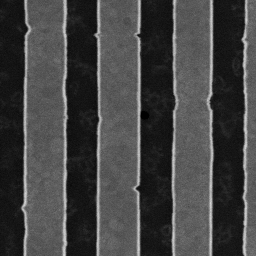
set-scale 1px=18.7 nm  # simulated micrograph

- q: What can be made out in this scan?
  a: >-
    one or a few lines or trenches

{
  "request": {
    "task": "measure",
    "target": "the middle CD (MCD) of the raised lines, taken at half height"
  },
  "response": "743 nm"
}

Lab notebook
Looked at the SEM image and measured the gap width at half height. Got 643 nm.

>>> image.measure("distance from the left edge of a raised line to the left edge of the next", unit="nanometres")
1380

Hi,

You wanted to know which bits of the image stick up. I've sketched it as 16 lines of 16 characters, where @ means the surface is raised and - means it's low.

--@@--@@@--@@--@
--@@--@@@--@@--@
--@@--@@@--@@--@
--@@--@@@--@@--@
--@@--@@@--@@--@
--@@--@@@--@@--@
--@@--@@@--@@--@
--@@--@@@--@@--@
--@@--@@@--@@--@
--@@--@@@--@@--@
--@@--@@@--@@--@
--@@--@@@--@@--@
--@@--@@@--@@--@
--@@--@@@--@@--@
--@@--@@@--@@--@
--@@--@@@--@@--@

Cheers